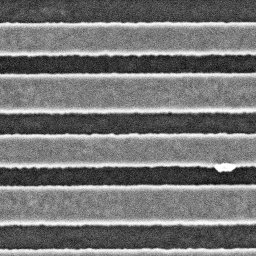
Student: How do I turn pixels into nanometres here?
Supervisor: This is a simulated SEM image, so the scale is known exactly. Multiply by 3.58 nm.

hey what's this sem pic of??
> lines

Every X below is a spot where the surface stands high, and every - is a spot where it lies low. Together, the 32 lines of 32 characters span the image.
--------------------------------
--------------------------------
--------------------------------
XXXXXXXXXXXXXXXXXXXXXXXXXXXXXXXX
XXXXXXXXXXXXXXXXXXXXXXXXXXXXXXXX
XXXXXXXXXXXXXXXXXXXXXXXXXXXXXXXX
XXXXXXXXXXXXXXXXXXXXXXXXXXXXXXXX
--------------------------------
--------------------------------
XXXXXXXXXXXXXXXXXXXXXXXXXXXXXXXX
XXXXXXXXXXXXXXXXXXXXXXXXXXXXXXXX
XXXXXXXXXXXXXXXXXXXXXXXXXXXXXXXX
XXXXXXXXXXXXXXXXXXXXXXXXXXXXXXXX
XXXXXXXXXXXXXXXXXXXXXXXXXXXXXXXX
--------------------------------
--------------------------------
--------------------------------
XXXXXXXXXXXXXXXXXXXXXXXXXXXXXXXX
XXXXXXXXXXXXXXXXXXXXXXXXXXXXXXXX
XXXXXXXXXXXXXXXXXXXXXXXXXXXXXXXX
XXXXXXXXXXXXXXXXXXXXXXXXXXXXXXXX
--------------------------------
--------------------------------
XXXXXXXXXXXXXXXXXXXXXXXXXXXXXXXX
XXXXXXXXXXXXXXXXXXXXXXXXXXXXXXXX
XXXXXXXXXXXXXXXXXXXXXXXXXXXXXXXX
XXXXXXXXXXXXXXXXXXXXXXXXXXXXXXXX
XXXXXXXXXXXXXXXXXXXXXXXXXXXXXXXX
--------------------------------
--------------------------------
--------------------------------
XXXXXXXXXXXXXXXXXXXXXXXXXXXXXXXX